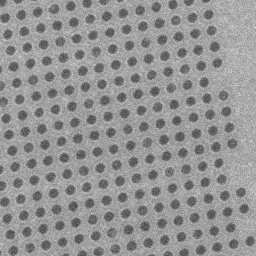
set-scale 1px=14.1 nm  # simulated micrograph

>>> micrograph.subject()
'a regular array of holes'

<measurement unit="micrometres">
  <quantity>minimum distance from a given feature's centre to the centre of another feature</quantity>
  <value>0.229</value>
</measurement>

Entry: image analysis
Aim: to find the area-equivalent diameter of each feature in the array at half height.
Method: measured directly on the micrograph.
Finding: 159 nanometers